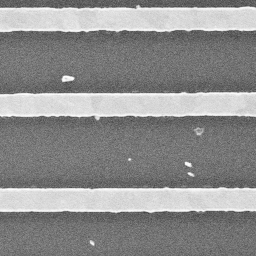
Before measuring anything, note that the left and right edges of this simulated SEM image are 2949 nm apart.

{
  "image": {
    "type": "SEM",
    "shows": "lines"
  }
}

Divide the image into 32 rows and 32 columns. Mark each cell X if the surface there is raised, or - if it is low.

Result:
--------------------------------
XXXXXXXXXXXXXXXXXXXXXXXXXXXXXXXX
XXXXXXXXXXXXXXXXXXXXXXXXXXXXXXXX
XXXXXXXXXXXXXXXXXXXXXXXXXXXXXXXX
--------------------------------
--------------------------------
--------------------------------
--------------------------------
--------------------------------
--------------------------------
--------------------------------
--------------------------------
XXXXXXXXXXXXXXXXXXXXXXXXXXXXXXXX
XXXXXXXXXXXXXXXXXXXXXXXXXXXXXXXX
--------------------------------
--------------------------------
--------------------------------
--------------------------------
--------------------------------
--------------------------------
--------------------------------
--------------------------------
--------------------------------
--------------------------------
XXXXXXXXXXXXXXXXXXXXXXXXXXXXXXXX
XXXXXXXXXXXXXXXXXXXXXXXXXXXXXXXX
--------------------------------
--------------------------------
--------------------------------
--------------------------------
--------------------------------
--------------------------------